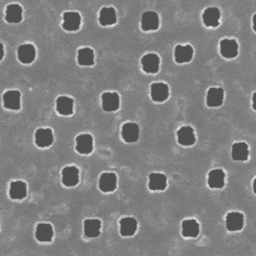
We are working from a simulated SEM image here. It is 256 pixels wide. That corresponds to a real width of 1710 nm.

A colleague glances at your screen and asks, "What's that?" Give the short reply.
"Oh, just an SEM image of a regular array of holes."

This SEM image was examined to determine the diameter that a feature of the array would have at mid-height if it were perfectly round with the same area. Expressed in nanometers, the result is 125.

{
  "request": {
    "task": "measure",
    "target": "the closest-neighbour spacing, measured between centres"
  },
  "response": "251 nanometres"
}